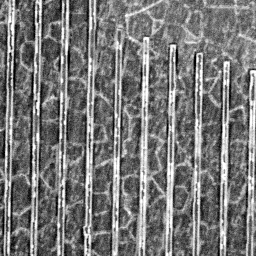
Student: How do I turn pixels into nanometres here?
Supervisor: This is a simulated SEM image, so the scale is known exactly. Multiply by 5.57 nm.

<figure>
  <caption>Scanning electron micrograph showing parallel lines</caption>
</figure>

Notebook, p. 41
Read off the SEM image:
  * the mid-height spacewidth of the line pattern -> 122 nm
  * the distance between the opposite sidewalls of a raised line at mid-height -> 27.8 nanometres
